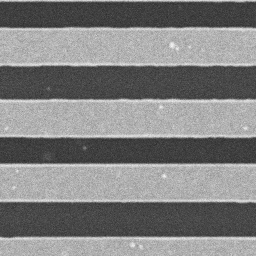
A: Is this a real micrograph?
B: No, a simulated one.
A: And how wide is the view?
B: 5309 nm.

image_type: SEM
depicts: lines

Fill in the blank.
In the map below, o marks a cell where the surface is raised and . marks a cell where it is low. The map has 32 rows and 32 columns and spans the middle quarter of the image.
................................
................................
................................
................................
................................
................................
................................
................................
................................
oooooooooooooooooooooooooooooooo
oooooooooooooooooooooooooooooooo
oooooooooooooooooooooooooooooooo
oooooooooooooooooooooooooooooooo
oooooooooooooooooooooooooooooooo
oooooooooooooooooooooooooooooooo
oooooooooooooooooooooooooooooooo
oooooooooooooooooooooooooooooooo
oooooooooooooooooooooooooooooooo
................................
................................
................................
................................
................................
................................
................................
oooooooooooooooooooooooooooooooo
oooooooooooooooooooooooooooooooo
oooooooooooooooooooooooooooooooo
oooooooooooooooooooooooooooooooo
oooooooooooooooooooooooooooooooo
oooooooooooooooooooooooooooooooo
oooooooooooooooooooooooooooooooo